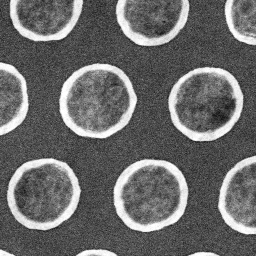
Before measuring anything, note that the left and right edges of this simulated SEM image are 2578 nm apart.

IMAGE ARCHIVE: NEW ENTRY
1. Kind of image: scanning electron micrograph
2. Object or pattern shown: raised bodies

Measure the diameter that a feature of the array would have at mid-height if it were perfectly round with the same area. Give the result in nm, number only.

686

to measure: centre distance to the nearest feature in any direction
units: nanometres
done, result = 1080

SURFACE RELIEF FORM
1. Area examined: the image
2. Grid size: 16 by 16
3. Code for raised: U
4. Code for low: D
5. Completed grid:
DUUUUDDDUUUUDDUU
DUUUDDDDUUUDDDUU
DDDDDDDDDUDDDDDU
DDDDDDDDDDDDDDDD
UDDDDUUDDDDDUUDD
UUDDUUUUDDDUUUUD
UUDDUUUUDDDUUUUD
UDDDUUUUDDDUUUUD
DDDDDDDDDDDDUDDD
DDDDDDDDDDDDDDDD
DDUUDDDDUUUDDDDU
DUUUUDDDUUUDDDUU
DUUUUDDUUUUDDDUU
DUUUDDDDUUUDDDUU
DDDDDDDDDDDDDDDD
DDDDDDDDDDDDDDDD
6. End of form